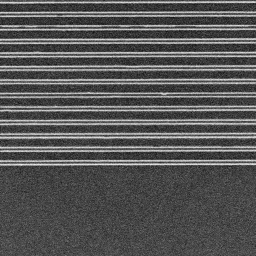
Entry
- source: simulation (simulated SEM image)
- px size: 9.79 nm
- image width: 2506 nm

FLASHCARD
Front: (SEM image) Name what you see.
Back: parallel lines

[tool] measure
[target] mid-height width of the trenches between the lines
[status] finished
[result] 97.9 nm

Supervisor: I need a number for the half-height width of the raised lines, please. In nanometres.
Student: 35.5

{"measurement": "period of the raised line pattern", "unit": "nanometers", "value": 132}